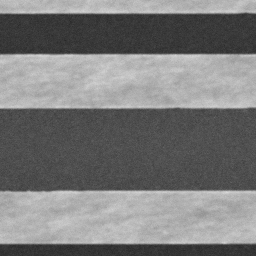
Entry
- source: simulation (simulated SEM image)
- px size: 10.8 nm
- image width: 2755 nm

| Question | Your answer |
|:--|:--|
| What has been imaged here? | lines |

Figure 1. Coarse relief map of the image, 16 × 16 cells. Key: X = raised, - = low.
XXXXXXXXXXXXXXXX
----------------
----------------
XXXXXXXXXXXXXXXX
XXXXXXXXXXXXXXXX
XXXXXXXXXXXXXXXX
XXXXXXXXXXXXXXXX
----------------
----------------
----------------
----------------
----------------
XXXXXXXXXXXXXXXX
XXXXXXXXXXXXXXXX
XXXXXXXXXXXXXXXX
----------------